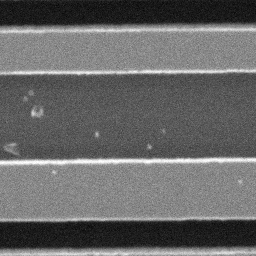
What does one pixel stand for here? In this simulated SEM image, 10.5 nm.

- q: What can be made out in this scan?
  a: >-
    lines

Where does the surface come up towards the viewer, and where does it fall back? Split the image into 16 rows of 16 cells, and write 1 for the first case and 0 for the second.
0000000000000000
0000000000000000
1111111111111111
1111111111111111
1111111111000000
0000000000000000
0000000000000000
0000000000000000
0000000000000000
0000000000000000
1111111111111111
1111111111111111
1111111111111111
1111111111111111
0000000000000000
0000000000000000